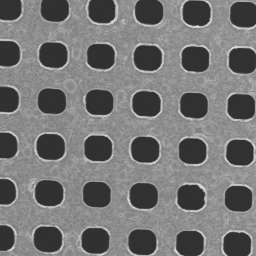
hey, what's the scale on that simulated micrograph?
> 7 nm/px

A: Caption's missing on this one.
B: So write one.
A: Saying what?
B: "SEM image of a regular array of holes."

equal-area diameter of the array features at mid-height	196	nanometers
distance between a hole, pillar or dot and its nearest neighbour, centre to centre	322	nm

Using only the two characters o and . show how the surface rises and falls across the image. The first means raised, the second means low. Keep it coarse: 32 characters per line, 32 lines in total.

...oo....oo...ooo...ooo...ooo...
...oo....oo...ooo...ooo...ooo...
o.oooo..oooo..ooo...ooo...ooo...
oooooooooooooooooooooooooooooooo
oooooooooooooooooooooooooooooooo
..ooo...oooo.ooooooooooooooooooo
..ooo...ooo...ooo...ooo...ooo...
..ooo...ooo...ooo...ooo...ooo...
oooooooooooo..ooo...ooo...ooo...
oooooooooooooooooooooooooooooooo
oooooooooooooooooooooooooooooooo
..ooo...ooo...ooo..ooooooooooooo
..ooo...ooo...ooo...ooo...ooo...
..ooo...ooo...ooo...oo....oo....
oooooooooooooooooo.oooo..oooo...
oooooooooooooooooooooooooooooooo
oooooooooooooooooooooooooooooooo
..ooo...ooo...ooo..oooo..ooooooo
..ooo...ooo...oo....oo....oo....
..ooo...ooo...ooo...oo....oo....
ooooooooooooooooooooooooooooo..o
oooooooooooooooooooooooooooooooo
.ooooooooooooooooooooooooooooooo
..oo....oo....oo...ooo...oooo..o
..oo....oo....oo....oo....oo...o
.oooo..oooo..ooo....oo....oo...o
oooooooooooooooooooooooooooooooo
oooooooooooooooooooooooooooooooo
.oooo..oooo.oooooooooooooooooooo
..oo....oo....oo...ooo...ooo...o
..oo....oo....oo....oo....oo...o
ooooooooooo..oooo..ooo...ooo...o